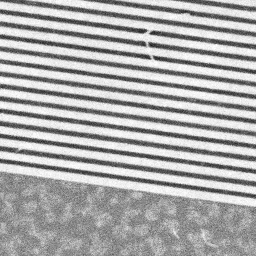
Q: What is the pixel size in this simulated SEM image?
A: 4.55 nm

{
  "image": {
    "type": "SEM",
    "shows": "parallel lines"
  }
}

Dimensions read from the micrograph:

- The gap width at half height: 22.5 nm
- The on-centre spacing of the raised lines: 0.0561 micrometres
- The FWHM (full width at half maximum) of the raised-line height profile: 31.5 nm